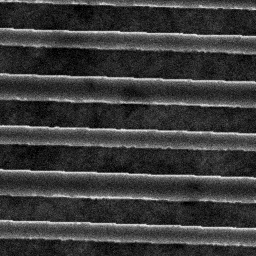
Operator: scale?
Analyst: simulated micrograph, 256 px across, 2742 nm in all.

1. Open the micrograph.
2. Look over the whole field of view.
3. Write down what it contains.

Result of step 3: lines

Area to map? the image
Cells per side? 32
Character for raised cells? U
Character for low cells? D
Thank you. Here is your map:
DDDDDDDDDDDDUUUUUUUUUUUUUUUUUUUU
DDDDDDDDDDDDDDDDDDDDDDDDDDDDDDDD
DDDDDDDDDDDDDDDDDDDDDDDDDDDDDDDD
DDDDDDDDDDDDDDDDDDDDDDDDDDDDDDDD
UUUUUUUUUUUUUUUUUUUUUUUUUUUUUUUD
DDUUUUUUUUUUUUUUUUUUUUUUUUUUUUUU
DDDDDDDDDDDDDDDDDDDDDDDDDDDDDUUU
DDDDDDDDDDDDDDDDDDDDDDDDDDDDDDDD
DDDDDDDDDDDDDDDDDDDDDDDDDDDDDDDD
UUUUUDDDDDDDDDDDDDDDDDDDDDDDDDDD
UUUUUUUUUUUUUUUUUUUUUUUUUUUUUUUU
UUUUUUUUUUUUUUUUUUUUUUUUUUUUUUUU
DDDDDDDDUUUUUUUUUUUUUUUUUUUUUUUU
DDDDDDDDDDDDDDDDDDDDDDDDDDDDDDDD
DDDDDDDDDDDDDDDDDDDDDDDDDDDDDDDD
DDDDDDDDDDDDDDDDDDDDDDDDDDDDDDDD
UUUUUUUUUUUUUUUUUUUUUUUUDDDDDDDD
UUUUUUUUUUUUUUUUUUUUUUUUUUUUUUUU
DDDDDDDDDDDDDDDDDDDDDDDDUUUUUUUU
DDDDDDDDDDDDDDDDDDDDDDDDDDDDDDDD
DDDDDDDDDDDDDDDDDDDDDDDDDDDDDDDD
UUUUUUUUDDDDDDDDDDDDDDDDDDDDDDDD
UUUUUUUUUUUUUUUUUUUUUUUUUUUUUUUU
UUUUUUUUUUUUUUUUUUUUUUUUUUUUUUUU
DDDDDDDUUUUUUUUUUUUUUUUUUUUUUUUU
DDDDDDDDDDDDDDDDDDDDDDDDDDDDDDDD
DDDDDDDDDDDDDDDDDDDDDDDDDDDDDDDD
DDDDDDDDDDDDDDDDDDDDDDDDDDDDDDDD
UUUUUUUUUUUUUUUUUUUUUUUUUUUUUDDD
UUUUUUUUUUUUUUUUUUUUUUUUUUUUUUUU
DDDDDDDDDDDDDDDDDDDDDDDDDDDDUUUU
DDDDDDDDDDDDDDDDDDDDDDDDDDDDDDDD